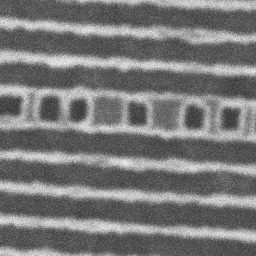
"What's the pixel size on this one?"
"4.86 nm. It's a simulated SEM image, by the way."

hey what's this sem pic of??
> parallel lines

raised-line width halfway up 0.0321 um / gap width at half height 128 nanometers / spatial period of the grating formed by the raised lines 0.159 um